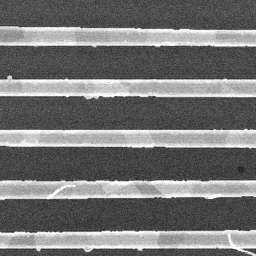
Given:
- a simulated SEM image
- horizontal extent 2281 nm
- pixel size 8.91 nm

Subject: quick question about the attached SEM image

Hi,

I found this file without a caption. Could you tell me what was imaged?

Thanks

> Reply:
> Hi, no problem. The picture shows lines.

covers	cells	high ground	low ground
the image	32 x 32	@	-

--------------------------------
--------------------------------
--------------------------------
@@@@----------------------------
@@@@@@@@@@@@@@@@@@@@@@@@@@@@@@@@
@@@@@@@@@@@@@@@@@@@@@@@@@@@@@@@@
--------------------------------
--------------------------------
--------------------------------
--------------------------------
@@@@@@@@@@@@@@@@@@@@@@@@@@@@@@@@
@@@@@@@@@@@@@@@@@@@@@@@@@@@@@@@@
--------------------------------
--------------------------------
--------------------------------
--------------------------------
@@@@@@@@@@@@@@@@@@@@@@@@@@@@@@@@
@@@@@@@@@@@@@@@@@@@@@@@@@@@@@@@@
--------------------------------
--------------------------------
--------------------------------
--------------------------------
--------------------------------
@@@@@@@@@@@@@@@@@@@@@@@@@@@@@@@@
@@@@@@@@@@@@@@@@@@@@@@@@--@@----
--------------------------------
--------------------------------
--------------------------------
--------------------------------
@@@@@@@@@@@@@@@@@@@@@@@@@@@@@@@@
@@@@@@@@@@@@@@@@@@@@@@@@@@@@@@@@
--------------------------------